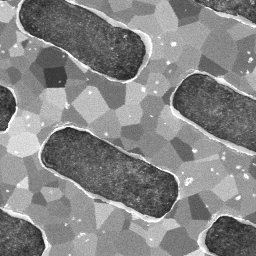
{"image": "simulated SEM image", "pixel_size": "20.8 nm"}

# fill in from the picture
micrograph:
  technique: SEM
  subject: holes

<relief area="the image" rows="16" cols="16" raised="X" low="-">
X----XXXXXXXX---
X-------XXXXXXXX
XXX------XXXXXXX
XXXXX----XXXXXXX
XXXXXX---XXXXXXX
XXXXXXXXXXX----X
-XXXXXXXXXX-----
-XXXXXXXXXXX----
XXX---XXXXXXX---
XXX-----XXXXXXX-
XXX-------XXXXXX
XXXXX------XXXXX
XXXXXXX----XXXXX
-XXXXXXXX-XXXXXX
---XXXXXXXXXX---
---XXXXXXXXXX---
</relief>